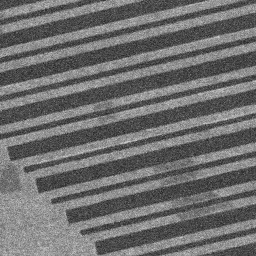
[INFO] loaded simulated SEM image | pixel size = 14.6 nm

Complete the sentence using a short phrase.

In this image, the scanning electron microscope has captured parallel lines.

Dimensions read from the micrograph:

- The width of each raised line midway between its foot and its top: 112 nm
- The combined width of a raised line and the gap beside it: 271 nanometers